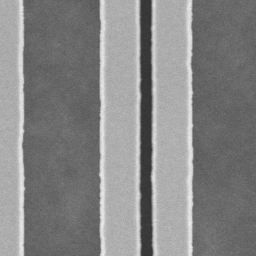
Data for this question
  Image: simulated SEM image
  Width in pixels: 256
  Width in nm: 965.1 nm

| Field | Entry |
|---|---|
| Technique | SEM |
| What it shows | lines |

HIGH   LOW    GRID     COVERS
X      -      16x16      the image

X-----XXXXXX----
X-----XXXXXX----
X-----XXXXXX----
X-----XXXXXX----
X-----XXXXXX----
X-----XXXXXX----
X-----XXXXXX----
X-----XXXXXX----
X-----XXXXXX----
X-----XXXXXX----
X-----XXXXXX----
XX----XXXXXX----
X-----XXXXXX----
X-----XXXXXX----
X-----XXXXXX----
X-----XXX-XX----